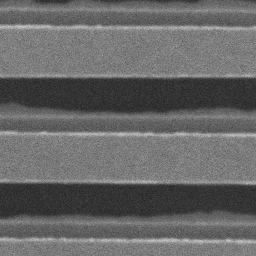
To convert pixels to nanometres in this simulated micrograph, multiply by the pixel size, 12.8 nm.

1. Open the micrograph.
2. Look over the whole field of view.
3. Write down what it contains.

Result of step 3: lines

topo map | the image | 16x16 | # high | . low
#########....##.
################
################
################
################
................
................
################
################
################
################
................
................
................
################
################